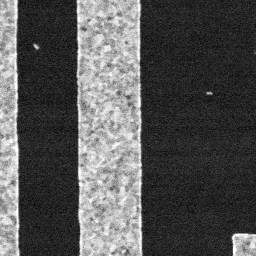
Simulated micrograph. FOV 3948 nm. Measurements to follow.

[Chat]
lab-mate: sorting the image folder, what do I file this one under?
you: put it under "wiring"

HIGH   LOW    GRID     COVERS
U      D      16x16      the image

UDDDDUUUUDDDDDDD
UDDDDUUUUDDDDDDD
UDDDDUUUUDDDDDDD
UDDDDUUUUDDDDDDD
UDDDDUUUUDDDDDDD
UDDDDUUUUDDDDDDD
UDDDDUUUUDDDDDDD
UDDDDUUUUDDDDDDD
UDDDDUUUUDDDDDDD
UDDDDUUUUDDDDDDD
UDDDDUUUUDDDDDDD
UDDDDUUUUDDDDDDD
UDDDDUUUUDDDDDDD
UDDDDUUUUDDDDDDD
UDDDDUUUUDDDDDDD
UDDDDUUUUDDDDDDU